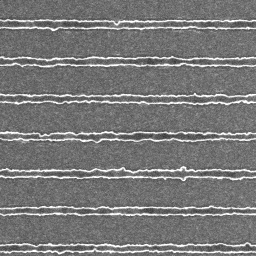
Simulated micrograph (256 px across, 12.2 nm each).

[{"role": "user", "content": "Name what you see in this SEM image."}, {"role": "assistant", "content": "parallel lines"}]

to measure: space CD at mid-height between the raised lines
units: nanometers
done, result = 368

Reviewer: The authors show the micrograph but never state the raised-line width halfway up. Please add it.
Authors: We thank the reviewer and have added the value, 94.7 nm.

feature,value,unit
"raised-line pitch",456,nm